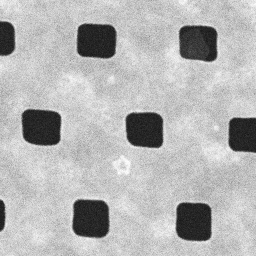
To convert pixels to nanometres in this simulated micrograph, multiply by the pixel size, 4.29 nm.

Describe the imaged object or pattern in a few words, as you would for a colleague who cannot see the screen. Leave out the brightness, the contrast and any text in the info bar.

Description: holes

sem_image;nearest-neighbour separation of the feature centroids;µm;0.438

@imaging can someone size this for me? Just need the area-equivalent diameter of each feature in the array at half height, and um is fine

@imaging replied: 0.174